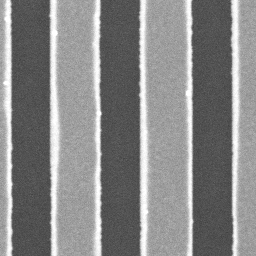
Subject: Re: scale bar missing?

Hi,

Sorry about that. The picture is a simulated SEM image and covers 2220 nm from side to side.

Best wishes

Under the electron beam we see lines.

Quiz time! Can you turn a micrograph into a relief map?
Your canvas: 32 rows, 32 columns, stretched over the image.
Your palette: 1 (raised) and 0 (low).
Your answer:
10000011111100000011111100000111
10000011111100000011111100000111
10000011111100000011111100000111
10000011111100000011111100000111
10000011111100000011111100000111
10000011111100000011111100000111
10000011111100000011111100000111
10000011111100000011111100000111
10000011111100000011111100000111
10000011111100000011111100000111
10000011111100000011111100000111
10000011111100000011111100000111
10000011111100000011111100000111
10000011111100000011111100000111
10000011111110000011111100000111
10000011111100000011111100000111
10000001111100000011111100000111
10000001111100000011111100000111
10000011111100000011111100000111
10000011111110000011111100000111
10000011111100000011111100000111
10000011111100000011111100000111
10000011111100000011111100000111
10000011111110000011111100000111
10000011111100000011111100000111
10000011111110000011111100000111
10000011111100000011111100000111
10000011111110000011111100000111
10000011111110000011111100000111
10000011111110000011111100000111
10000001111110000011111100000111
10000011111110000011111100000111